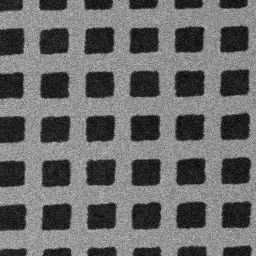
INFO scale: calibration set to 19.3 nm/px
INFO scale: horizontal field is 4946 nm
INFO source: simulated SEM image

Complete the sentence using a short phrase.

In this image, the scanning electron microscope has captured a regular array of holes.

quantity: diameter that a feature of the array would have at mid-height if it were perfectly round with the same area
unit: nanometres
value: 605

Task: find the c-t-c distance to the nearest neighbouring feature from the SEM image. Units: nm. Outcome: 845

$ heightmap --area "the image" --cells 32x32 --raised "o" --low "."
...oo...oo....oo....oo...oo....o
.ooooooooooooooooooooooooooooooo
oooooooooooooooooooooooooooooooo
o.ooooo.ooo...ooo..ooo...ooo...o
...oo....oo...oo....oo....oo...o
...oo....oo...oo....oo....o....o
...oo...ooo...oo...ooo...ooo..oo
oooooooooooooooooooooooooooooooo
oooooooooooooooooooooooooooooooo
...oo....oo...oo....oo....oo...o
...oo....oo...oo....oo....o....o
...oo....oo...oo....oo...oo....o
oooooooooooooooooooooooooooooooo
oooooooooooooooooooooooooooooooo
o.oooo.oooo...ooo...oo...ooo...o
...oo....oo...oo....oo....oo...o
...oo....oo...oo....oo....o....o
...oo...ooo...oo....oo...ooo...o
oooooooooooooooooooooooooooooooo
oooooooooooooooooooooooooooooooo
...oo....oo...oo....oo....oo...o
...oo....oo...oo....oo....oo...o
...oo....oo...oo....oo....oo...o
.ooooooooooooooooooooooooooooooo
oooooooooooooooooooooooooooooooo
oo.ooo...oo...ooo...ooo...oo...o
...oo....oo....o....oo....oo...o
...oo....oo....o....oo....oo...o
...oo....oo...ooo...oo...ooo...o
oooooooooooooooooooooooooooooooo
oooooooooooooooooooooooooooooooo
...oo....oo....oo...oo....oo...o